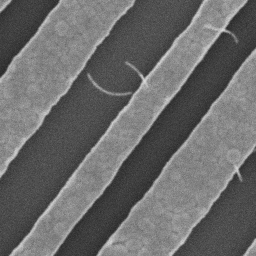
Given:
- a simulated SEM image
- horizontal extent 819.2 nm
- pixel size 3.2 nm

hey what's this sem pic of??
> lines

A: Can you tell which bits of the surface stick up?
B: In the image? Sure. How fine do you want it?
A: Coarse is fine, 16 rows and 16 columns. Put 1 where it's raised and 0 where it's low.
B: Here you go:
0001111100000110
0001111000001100
0011110000011000
0111110000111000
1111100001110001
1111000001100011
1110000011000111
1110000111000111
1100001110001111
1000001100011111
0000011000111110
0000111000111100
0001110001111100
0001100011111000
0011000111110000
0111001111100000